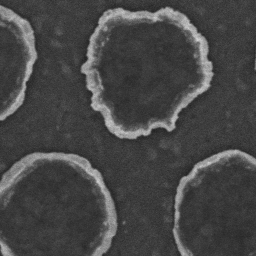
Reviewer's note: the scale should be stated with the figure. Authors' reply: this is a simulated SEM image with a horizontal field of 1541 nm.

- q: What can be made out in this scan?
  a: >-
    raised bodies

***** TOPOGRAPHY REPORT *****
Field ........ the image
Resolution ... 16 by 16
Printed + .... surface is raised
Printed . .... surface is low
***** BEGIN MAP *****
................
+.....++++++....
++....+++++++...
++....+++++++...
++...++++++++...
++....+++++++...
+.....++++++....
.......++++.....
................
................
.++++.......++++
++++++.....+++++
+++++++....+++++
+++++++....+++++
+++++++....+++++
++++++.....+++++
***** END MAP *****